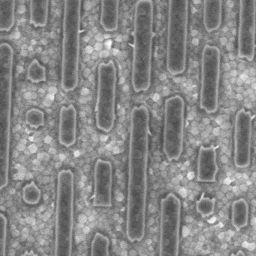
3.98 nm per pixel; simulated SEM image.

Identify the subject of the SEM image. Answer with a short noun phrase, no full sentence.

parallel lines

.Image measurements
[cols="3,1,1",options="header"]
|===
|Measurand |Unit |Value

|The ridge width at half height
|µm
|0.0655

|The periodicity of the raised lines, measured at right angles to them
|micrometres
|0.139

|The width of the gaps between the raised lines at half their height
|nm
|72.5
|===